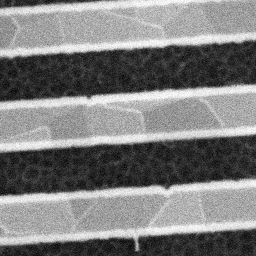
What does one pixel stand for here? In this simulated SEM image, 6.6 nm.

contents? one or a few lines or trenches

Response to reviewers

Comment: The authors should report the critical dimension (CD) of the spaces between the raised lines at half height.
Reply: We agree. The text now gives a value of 347 nm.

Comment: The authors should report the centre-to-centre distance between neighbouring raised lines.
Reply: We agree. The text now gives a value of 621 nanometres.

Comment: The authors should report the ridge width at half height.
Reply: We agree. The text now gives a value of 271 nanometers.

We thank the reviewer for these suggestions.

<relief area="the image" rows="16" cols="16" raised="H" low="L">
LLLLHHHHHHHHHHHH
HHHHHHHHHHHHHHHH
HHHHHHHHHHHHLLLL
LLLLLLLLLLLLLLLL
LLLLLLLLLLLLLLLL
LLLLLLLLLLLLLLLL
LLHHHHHHHHHHHHHH
HHHHHHHHHHHHHHHH
HHHHHHHHHHHLLLLL
LLLLLLLLLLLLLLLL
LLLLLLLLLLLLLLLL
LLLLLLLLLLLLLLLH
HHHHHHHHHHHHHHHH
HHHHHHHHHHHHHHHH
HHHHHHHHHLLLLLLL
LLLLLLLLLLLLLLLL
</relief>